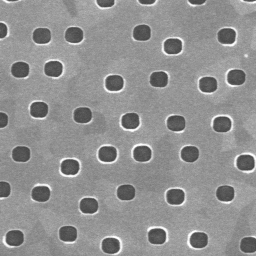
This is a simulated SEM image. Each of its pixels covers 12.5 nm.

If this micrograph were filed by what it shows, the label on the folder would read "a regular array of holes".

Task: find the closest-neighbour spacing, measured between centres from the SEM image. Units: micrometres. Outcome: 0.469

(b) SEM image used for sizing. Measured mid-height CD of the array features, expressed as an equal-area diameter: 18.2 px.